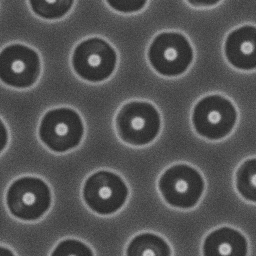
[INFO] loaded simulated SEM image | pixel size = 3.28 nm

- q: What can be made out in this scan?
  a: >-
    an array of small figures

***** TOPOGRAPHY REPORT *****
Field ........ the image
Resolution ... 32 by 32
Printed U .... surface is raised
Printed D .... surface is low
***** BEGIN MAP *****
UUUUDDDDDUUUUDDDDDUUUUUUDDDUUUUU
UUUUDDDDDUUUUUUDDUUUUUUUUUUUUUUU
UUUUUUUUUUUUUUUUUUUUUUUUUUUUUUUU
UUUUUUUUUUUUUUUUUUUUUUUUUUUUUUDD
UUUUUUUUUUUUUUUUUUUUDDDUUUUUDDDD
UUDUUUUUUUDDDDUUUUUDDDDDUUUUDDDD
DDDDDUUUUDDDDDUUUUDDDUDDUUUUDDDD
DDDDDUUUUDDUDDDUUUUDDDDDUUUUDDDD
DDUDDUUUUDDDDDUUUUUDDDDDUUUUUDDD
DDDDDUUUUUDDDDUUUUUUDDUUUUUUUUUU
UDDDUUUUUUUUUUUUUUUUUUUUUUUUUUUU
UUUUUUUUUUUUUUUUUUUUUUUUUUUUUUUU
UUUUUUUUUUUUUUUUUUUUUUUUUDDDDUUU
UUUUUUUDDUUUUUUDDDDUUUUUDDDDDUUU
UUUUUDDDDDUUUUUDDDDDUUUUDDUDDDUU
DUUUUDDDDDUUUUDDDUDDUUUUDDDDDUUU
DUUUUDDUDDUUUUUDDDDDUUUUDDDDDUUU
DUUUUDDDDDUUUUUDDDDUUUUUUUUUUUUU
DUUUUUDDDUUUUUUUUUUUUUUUUUUUUUUU
UUUUUUUUUUUUUUUUUUUUUUUUUUUUUUUU
UUUUUUUUUUUUUUUUUUUUUUDUUUUUUUDD
UUUUUUUUUUUUDDUUUUUUUDDDDUUUUDDD
UUDDDUUUUUUDDDDUUUUUDDDDDUUUUDDD
UDDDDDUUUUDDDDDDUUUUDDUDDDUUUUDD
UDDUDDUUUUDDDUDDUUUUDDDDDUUUUUDD
UDDDDDUUUUUDDDDDUUUUUDDDDUUUUUUU
UDDDDDUUUUUUDDUUUUUUUUUUUUUUUUUU
UUUDDUUUUUUUUUUUUUUUUUUUUUUUUUUU
UUUUUUUUUUUUUUUUUUUUUUUUUUUDDUUU
UUUUUUUUUUUUUUUUUDDDUUUUUUDDDDDU
UUUUUUUDDDDUUUUUDDDDDUUUUDDDDDDU
DDUUUUDDDDDDUUUUDDUDDUUUUDDDUDDU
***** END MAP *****